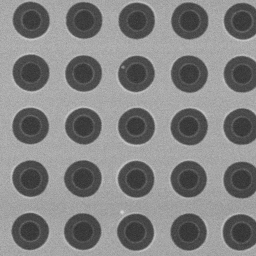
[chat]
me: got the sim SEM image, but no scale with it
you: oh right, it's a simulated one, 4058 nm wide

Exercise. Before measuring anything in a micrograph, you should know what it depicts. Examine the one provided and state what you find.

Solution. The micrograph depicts an array of small figures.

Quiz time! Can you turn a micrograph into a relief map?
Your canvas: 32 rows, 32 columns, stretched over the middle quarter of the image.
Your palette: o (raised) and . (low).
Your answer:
o..oooo..ooooo..oooo..ooooo...oo
..ooooo...ooo...ooooo..oooo..ooo
..ooooo...ooo...ooooo..ooo...ooo
...oooo..oooo...oooo...oooo..ooo
o..ooo...ooooo..oooo..ooooo...oo
o.......oooooo........oooooo....
ooo....oooooooo.....ooooooooo...
oooooooooooooooooooooooooooooooo
oooooooooooooooooooooooooooooooo
oooooooooooooooooooooooooooooooo
oooooooooooooooooooooooooooooooo
oo.....ooooooooo.....oooooooo...
o.......ooooooo.......oooooo....
...oooo..ooooo...oo...ooooo...oo
...oooo...oooo..oooo...oooo..ooo
..ooooo...ooo...oooo...ooo...ooo
...oooo..oooo...oooo...oooo..ooo
o..oooo..ooooo..oooo...oooo...oo
o.......oooooo........ooooo.....
oo.....oooooooo......ooooooo....
ooooooooooooooooooooooooooooooo.
oooooooooooooooooooooooooooooooo
oooooooooooooooooooooooooooooooo
oooooooooooooooooooooooooooooooo
ooo....ooooooooo....ooooooooo...
o.......ooooooo......ooooooo....
...ooo...ooooo...oo...ooooo.....
..ooooo..oooo...oooo...oooo..ooo
..ooooo...ooo...ooooo..ooo...ooo
..ooooo...ooo...ooooo..oooo..ooo
...oooo..ooooo..oooo..ooooo..ooo
o........ooooo........ooooo.....